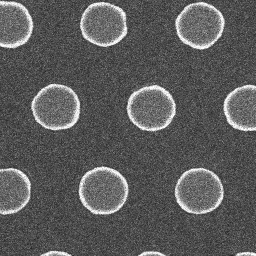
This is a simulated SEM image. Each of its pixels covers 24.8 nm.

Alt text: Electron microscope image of raised bodies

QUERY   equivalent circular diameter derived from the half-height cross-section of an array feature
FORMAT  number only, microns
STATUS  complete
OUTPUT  1.12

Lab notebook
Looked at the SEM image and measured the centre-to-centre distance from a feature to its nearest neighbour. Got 2360 nanometers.